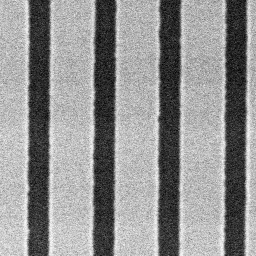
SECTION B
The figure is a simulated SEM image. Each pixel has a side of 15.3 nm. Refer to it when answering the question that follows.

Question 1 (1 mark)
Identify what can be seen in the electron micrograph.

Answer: lines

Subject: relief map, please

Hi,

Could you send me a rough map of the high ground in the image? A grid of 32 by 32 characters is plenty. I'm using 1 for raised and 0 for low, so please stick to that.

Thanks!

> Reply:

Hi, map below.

11110011111100011111000111110001
11110011111100011111000111110001
11110011111100011111000111110001
11110011111100011111000111110001
11110011111100011111000111110001
11110011111100011111000111110001
11110011111100111111000111110001
11110011111100011111000111110001
11110011111100011111000111110001
11110011111100011111000111110001
11110011111100111111000111110001
11100011111100111111000111110001
11100011111100111111000111110001
11110011111100111111000111110001
11110011111100111111000111110001
11110011111100111111000111110001
11110011111100111111000111110001
11110011111100111111000111110001
11110011111100111111000111110001
11110011111100111111000111110001
11100011111100111111000111110001
11100011111100111111000111110001
11100011111100111111000111110001
11110011111100111111001111110001
11100011111100111111001111110001
11100011111100111111001111110001
11100011111100111111001111110001
11100011111100111111001111110001
11100011111100111111001111110001
11100011111100111111001111110001
11100011111100111111001111110001
11100011111100111111001111110001